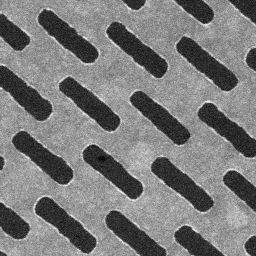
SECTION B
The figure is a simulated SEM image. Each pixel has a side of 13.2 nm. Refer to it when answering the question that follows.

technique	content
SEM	a regular array of holes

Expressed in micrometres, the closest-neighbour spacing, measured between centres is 0.93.